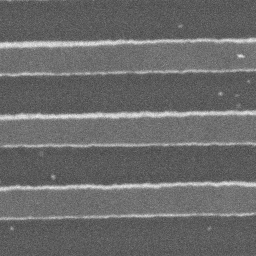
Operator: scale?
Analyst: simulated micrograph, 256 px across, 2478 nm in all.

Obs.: lines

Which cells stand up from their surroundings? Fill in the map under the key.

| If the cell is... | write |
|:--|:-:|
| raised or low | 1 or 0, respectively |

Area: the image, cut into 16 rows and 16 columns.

0000000000000000
0000000000000000
0000000000000001
1111111111111111
1111111111111100
0000000000000000
0000000000000000
1111111111111111
1111111111111111
0000000000000000
0000000000000000
0000000000111111
1111111111111111
1111111111000000
0000000000000000
0000000000000000